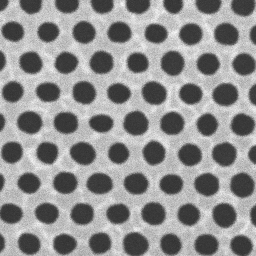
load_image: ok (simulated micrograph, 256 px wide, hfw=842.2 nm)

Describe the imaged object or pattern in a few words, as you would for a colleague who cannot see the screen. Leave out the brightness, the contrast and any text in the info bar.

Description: a regular array of holes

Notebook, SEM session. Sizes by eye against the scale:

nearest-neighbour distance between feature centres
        0.113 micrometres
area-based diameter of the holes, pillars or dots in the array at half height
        0.0763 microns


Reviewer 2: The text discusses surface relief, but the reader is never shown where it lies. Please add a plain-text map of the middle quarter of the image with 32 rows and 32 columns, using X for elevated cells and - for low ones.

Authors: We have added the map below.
---XXX------XXXX-----XXX------XX
---XXXX-----XXXXX----XXXX-----XX
-XXXXXXX--XXXXXXXXXXXXXXX----XXX
XXXXXXXXXXXXXXXXXXXXXXXXXXXXXXXX
XXX---XXXXXXXXXXXXXXX--XXXXXXXXX
XX------XXXX----XXXX-----XXXXX--
XX------XXX------XX------XXXX---
XX------XXX------XX-------XXX---
XX------XXX-----XXXX------XXX---
XXX----XXXXX----XXXXX----XXXXX--
XXXXXXXXXXXXXXXXXXXXXXXXXXXXXXXX
XXXXXXXXXXXXXXXXXXXXXXXXXXXXXXXX
--XXXXXXX-XXXXXX----XXXXX----XXX
---XXXX-----XXX------XXX------XX
----XX------XXX------XXX------XX
----XX------XXX------XXX------XX
---XXXX-----XXX------XXX------XX
-XXXXXXXXXXXXXXX----XXXXXX--XXXX
XXXXXXXXXXXXXXXXXXXXXXXXXXXXXXXX
XXXX-XXXXXXXX-XXXXXXX---XXXXXXXX
XX-----XXXXX----XXXX-----XXXXX--
X-------XXX-----XXXX-----XXXX---
X-------XXX-----XXXX-----XXX----
XX------XXX-----XXXX-----XXXX---
XXX----XXXXX---XXXXXX---XXXXX---
XXXXXXXXXXXXXXXXXXXXXXXXXXXXXXX-
XXXXXXXXXXXXXXXXXXXXXXXXXXXXXXXX
--XXXXX----XXXXX----XXXXXX-XXXXX
---XXX------XXX------XXX-----XXX
----XX------XXX------XXX------XX
---XXX------XXX------XXX------XX
---XXX------XXXX-----XXX-----XXX